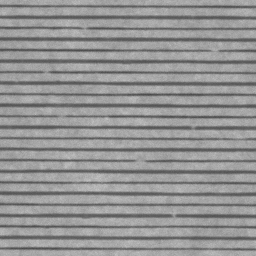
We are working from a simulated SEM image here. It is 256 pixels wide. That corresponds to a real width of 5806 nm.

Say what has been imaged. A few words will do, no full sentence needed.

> parallel lines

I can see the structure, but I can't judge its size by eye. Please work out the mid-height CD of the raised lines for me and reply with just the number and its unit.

173 nm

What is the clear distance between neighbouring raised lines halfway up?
0.0766 um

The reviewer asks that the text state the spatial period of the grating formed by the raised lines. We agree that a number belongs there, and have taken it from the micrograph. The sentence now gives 251 nm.